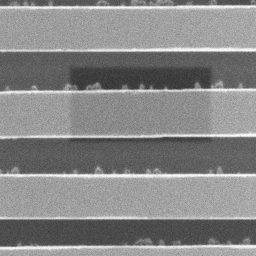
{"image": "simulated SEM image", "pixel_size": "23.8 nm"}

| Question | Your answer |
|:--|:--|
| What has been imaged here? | lines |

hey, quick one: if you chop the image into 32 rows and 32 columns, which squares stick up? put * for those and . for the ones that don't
................................
********************************
********************************
********************************
********************************
********************************
................................
................................
................................
................................
................................
.*******************************
********************************
********************************
********************************
********************************
********************************
................................
................................
................................
................................
................................
********************************
********************************
********************************
********************************
********************************
................................
................................
................................
................................
********************************